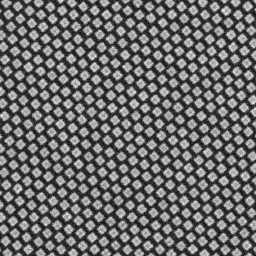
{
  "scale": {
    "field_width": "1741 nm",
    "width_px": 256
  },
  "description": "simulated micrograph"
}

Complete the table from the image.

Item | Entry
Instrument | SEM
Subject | a regular array of raised bodies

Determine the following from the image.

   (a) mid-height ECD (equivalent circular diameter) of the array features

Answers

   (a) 53.7 nanometers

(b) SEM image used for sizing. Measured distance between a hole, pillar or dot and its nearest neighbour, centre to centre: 12 px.